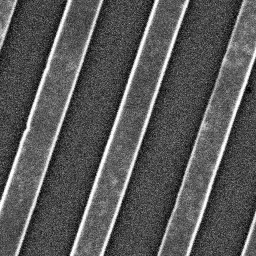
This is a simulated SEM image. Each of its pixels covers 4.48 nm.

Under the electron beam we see one or a few lines or trenches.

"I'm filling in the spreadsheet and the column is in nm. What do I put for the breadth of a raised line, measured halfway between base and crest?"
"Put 132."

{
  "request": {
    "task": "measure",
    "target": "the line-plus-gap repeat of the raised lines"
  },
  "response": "366 nanometres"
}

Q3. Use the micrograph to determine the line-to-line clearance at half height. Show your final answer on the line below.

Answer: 232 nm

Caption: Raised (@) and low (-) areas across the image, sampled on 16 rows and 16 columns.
@---@@----@@---@
----@@---@@----@
----@@---@@---@@
---@@----@@---@@
---@@---@@----@@
---@@---@@---@@-
--@@----@@---@@-
--@@---@@----@@-
--@@---@@---@@--
-@@----@@---@@--
-@@---@@----@@--
-@@---@@---@@---
@@----@@---@@---
@@---@@----@@---
@@---@@---@@----
@----@@---@@---@